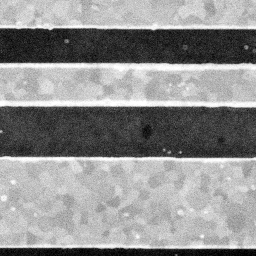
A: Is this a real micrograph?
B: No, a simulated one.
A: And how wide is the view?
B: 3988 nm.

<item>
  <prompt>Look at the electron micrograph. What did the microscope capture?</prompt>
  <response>lines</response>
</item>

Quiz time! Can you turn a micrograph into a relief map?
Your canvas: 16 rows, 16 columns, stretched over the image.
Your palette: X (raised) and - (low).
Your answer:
XXXXXXXXXXXXXXXX
XXXXXXXXXXXXXXXX
----------------
----------------
XXXXXXXXXXXXXXXX
XXXXXXXXXXXXXXXX
XXXXXXXXXXXXXXXX
----------------
----------------
----------------
XXXXXXXXXXXXXXXX
XXXXXXXXXXXXXXXX
XXXXXXXXXXXXXXXX
XXXXXXXXXXXXXXXX
XXXXXXXXXXXXXXXX
---------XXXXXXX